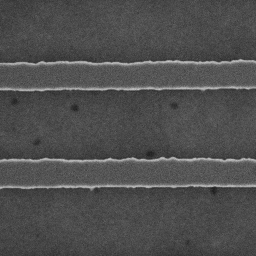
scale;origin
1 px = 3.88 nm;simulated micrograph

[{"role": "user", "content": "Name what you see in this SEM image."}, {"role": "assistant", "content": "lines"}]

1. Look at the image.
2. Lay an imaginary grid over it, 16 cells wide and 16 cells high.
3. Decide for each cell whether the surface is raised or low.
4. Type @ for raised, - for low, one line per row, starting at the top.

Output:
----------------
----------------
----------------
----------------
@@@@@@@@@@@@@@@@
@@@@@@@@@@@@@@-@
----------------
----------------
----------------
----------------
@@@@@@@@@@@@@@@@
@@@@@@@@@@@@@@@@
----------------
----------------
----------------
----------------